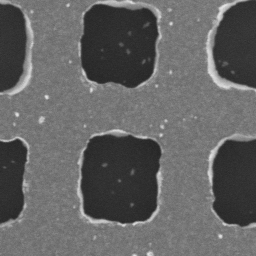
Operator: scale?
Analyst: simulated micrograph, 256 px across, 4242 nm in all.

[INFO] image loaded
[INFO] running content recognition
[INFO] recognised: holes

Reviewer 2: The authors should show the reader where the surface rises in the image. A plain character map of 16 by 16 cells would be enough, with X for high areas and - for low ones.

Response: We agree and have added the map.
-XXXXX---XXXXX--
--XXX-----XXXX--
--XXX-----XXX---
--XXX-----XXX---
--XXX-----XXX---
-XXXXXXXXXXXXXXX
XXXXXXXXXXXXXXXX
XXXXXXXXXXXXXXXX
XXXXXX--XXXXXXXX
--XXX-----XXXX--
--XXX-----XXX---
-XXXX-----XXX---
--XXX-----XXX---
-XXXXX---XXXXX--
XXXXXXXXXXXXXXXX
XXXXXXXXXXXXXXXX